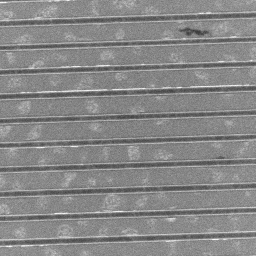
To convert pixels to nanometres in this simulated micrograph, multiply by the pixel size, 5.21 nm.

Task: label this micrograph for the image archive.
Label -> parallel lines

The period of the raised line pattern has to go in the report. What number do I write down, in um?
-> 0.127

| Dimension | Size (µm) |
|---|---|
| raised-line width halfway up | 0.0332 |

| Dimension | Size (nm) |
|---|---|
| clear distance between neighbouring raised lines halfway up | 93.1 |